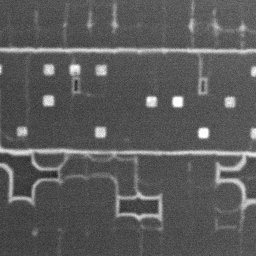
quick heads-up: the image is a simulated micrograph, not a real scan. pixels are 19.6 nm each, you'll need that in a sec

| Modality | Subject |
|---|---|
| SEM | wiring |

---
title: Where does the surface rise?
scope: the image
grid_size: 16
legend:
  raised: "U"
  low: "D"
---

DDDDDDDDDDDDDDDD
DDDDDDDDDDDDDDDD
DDDDDDDDDDDDDDDD
UUUUUUUUUUUUUUUU
UUUUUUUUUUUUUUUU
UUUUUUUUUUUUUUUU
UUUUUUUUUUUUUUUU
UUUUUUUUUUUUUUUU
UUUUUUUUUUUUUUUU
DDDDUUUUUUUUUUUU
DDDDDDDDDDDDDDDD
DDDDDDDDDDDDDDDD
DDDDDDDDDDDDDDDD
DDDDDDDDDDDDDDDD
DDDDDDDDDDDDDDDD
DDDDDDDDDDDDDDDD